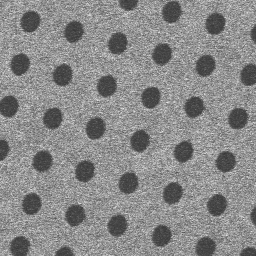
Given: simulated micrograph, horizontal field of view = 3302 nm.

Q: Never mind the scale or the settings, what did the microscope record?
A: a regular array of holes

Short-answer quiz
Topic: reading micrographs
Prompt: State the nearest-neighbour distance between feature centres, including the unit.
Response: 0.567 µm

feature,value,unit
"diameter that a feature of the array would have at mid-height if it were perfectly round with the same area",275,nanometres